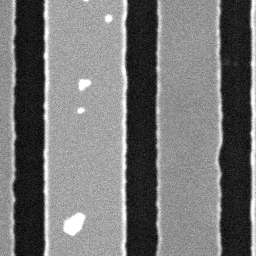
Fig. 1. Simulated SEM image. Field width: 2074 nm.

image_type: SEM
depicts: lines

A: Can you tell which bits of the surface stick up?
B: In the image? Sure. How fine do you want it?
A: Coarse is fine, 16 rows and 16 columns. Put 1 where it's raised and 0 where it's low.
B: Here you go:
1001111100111100
1001111100111100
1001111100111100
1001111100111100
1001111100111100
1001111100111100
1001111100111100
1001111100111100
1001111100111100
1001111100111100
1001111100111100
1001111100111100
1001111100111100
1001111100111100
1001111100111100
1001111100111100